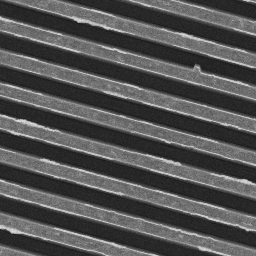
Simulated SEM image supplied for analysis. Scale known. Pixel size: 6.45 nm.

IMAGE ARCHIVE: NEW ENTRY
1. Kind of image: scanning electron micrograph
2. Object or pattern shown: parallel lines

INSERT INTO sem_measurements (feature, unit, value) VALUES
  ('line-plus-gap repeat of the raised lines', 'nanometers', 203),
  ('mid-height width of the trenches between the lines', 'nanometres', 97.3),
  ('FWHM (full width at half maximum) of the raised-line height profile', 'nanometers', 103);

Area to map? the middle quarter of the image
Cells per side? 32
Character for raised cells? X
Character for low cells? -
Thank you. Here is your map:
---------------XXXXXXXXXXXXXXX--
XXXX---------------XXXXXXXXXXXXX
XXXXXXXX--------------XXXXXXXXXX
XXXXXXXXXXX---------------XXXXXX
XXXXXXXXXXXXXXX---------------XX
----XXXXXXXXXXXXXX--------------
-------XXXXXXXXXXXXXXX----------
-----------XXXXXXXXXXXXXXX------
--------------XXXXXXXXXXXXXXXX--
XXX---------------XXXXXXXXXXXXXX
XXXXXXX---------------XXXXXXXXXX
XXXXXXXXXX---------------XXXXXXX
XXXXXXXXXXXXXX---------------XXX
---XXXXXXXXXXXXXXX--------------
------XXXXXXXXXXXXXXX-----------
----------XXXXXXXXXXXXXXX-------
--------------XXXXXXXXXXXXXXX---
XX---------------XXXXXXXXXXXXXXX
XXXXXX---------------XXXXXXXXXXX
XXXXXXXXX----------------XXXXXXX
XXXXXXXXXXXXX----------------XXX
--XXXXXXXXXXXXXXX---------------
------XXXXXXXXXXXXXXX-----------
---------XXXXXXXXXXXXXXX--------
-------------XXXXXXXXXXXXXXXX---
XX---------------XXXXXXXXXXXXXXX
XXXXXX--------------XXXXXXXXXXXX
XXXXXXXXX---------------XXXXXXXX
XXXXXXXXXXXXX---------------XXXX
--XXXXXXXXXXXXXXX--------------X
-----XXXXXXXXXXXXXXX------------
---------XXXXXXXXXXXXXXX--------